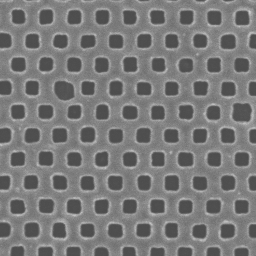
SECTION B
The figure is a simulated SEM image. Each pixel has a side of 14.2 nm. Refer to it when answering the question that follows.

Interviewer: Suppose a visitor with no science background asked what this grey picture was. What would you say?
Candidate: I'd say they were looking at a regular array of holes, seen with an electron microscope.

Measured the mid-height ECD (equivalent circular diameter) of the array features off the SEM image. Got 217 nanometres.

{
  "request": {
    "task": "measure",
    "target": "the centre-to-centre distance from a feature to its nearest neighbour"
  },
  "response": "383 nm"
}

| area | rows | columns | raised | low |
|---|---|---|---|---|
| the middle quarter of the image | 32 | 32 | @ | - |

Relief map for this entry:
@----@@@---@@@@---@@@@---@@@@---
@---@@@@---@@@@---@@@@---@@@@---
@@@@@@@@@@@@@@@@@@@@@@@@@@@@@@@@
@@@@@@@@@@@@@@@@@@@@@@@@@@@@@@@@
-@@@@--@@@@@--@@@@@--@@@@@--@@@@
--@@----@@@----@@@----@@@----@@@
---@----@@@----@@@----@@@----@@@
---@@--@@@@@--@@@@----@@@---@@@@
--@@@@@@@@@@@@@@@@@@@@@@@@@@@@@@
@@@@@@@@@@@@@@@@@@@@@@@@@@@@@@@@
@---@@@@---@@@@---@@@@---@@@@---
@---@@@@---@@@-----@@@---@@@@---
@---@@@@---@@@-----@@@---@@@@---
@---@@@@---@@@@---@@@@---@@@@---
@@@@@@@@@@@@@@@@@@@@@@@@@@@@@@@@
@@@@@@@@@@@@@@@@@@@@@@@@@@@@@@@@
-@@@----@@@----@@@---@@@@@--@@@@
-@@@----@@@----@@@----@@@----@@@
-@@@----@@@----@@@----@@@----@@@
@@@@@--@@@@---@@@@@--@@@@@--@@@@
@@@@@@@@@@@@@@@@@@@@@@@@@@@@@@@@
@@@@@@@@@@@@@@@@@@@@@@@@@@@@@@@@
@---@@@@---@@@@---@@@@---@@@@---
@---@@@@---@@@@---@@@@---@@@----
@---@@@@---@@@@---@@@@---@@@----
@@--@@@@@-@@@@@---@@@@@--@@@@---
@@@@@@@@@@@@@@@@@@@@@@@@@@@@@@@@
@@@@@@@@@@@@@@@@@@@@@@@@@@@@@@@@
-@@@---@@@@----@@@----@@@----@@@
-@@@----@@@----@@@----@@@----@@@
-@@@----@@@----@@@----@@@----@@@
@@@@@@@@@@@@--@@@@@--@@@@---@@@@